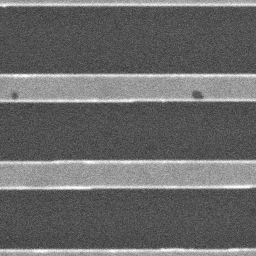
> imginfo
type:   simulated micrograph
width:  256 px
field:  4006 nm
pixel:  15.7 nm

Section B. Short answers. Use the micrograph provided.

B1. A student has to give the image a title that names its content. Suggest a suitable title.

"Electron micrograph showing lines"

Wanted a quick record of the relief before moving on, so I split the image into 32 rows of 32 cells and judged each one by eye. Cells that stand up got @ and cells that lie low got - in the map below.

@@@@@@@@@@@@@@@@@@@@@@@@@@@@@@@@
--------------------------------
--------------------------------
--------------------------------
--------------------------------
--------------------------------
--------------------------------
--------------------------------
--------------------------------
@@@@@@@@@@@@@@@@@@@@@@@@@@@@@@@@
@@@@@@@@@@@@@@@@@@@@@@@@@@@@@@@@
@@@@@@@@@@@@@@@@@@@@@@@@@@@@@@@@
@@@@@@@@@@@@@@@@@@@@@@@@@@@@@@@@
--------------------------------
--------------------------------
--------------------------------
--------------------------------
--------------------------------
--------------------------------
--------------------------------
@@@@@@@@@@@@@@@@@@@@@@@@@@@@@@@@
@@@@@@@@@@@@@@@@@@@@@@@@@@@@@@@@
@@@@@@@@@@@@@@@@@@@@@@@@@@@@@@@@
@@@@@@@@@@@@--------------------
--------------------------------
--------------------------------
--------------------------------
--------------------------------
--------------------------------
--------------------------------
--------------------------------
@@@@@@@@@@@@@@@@@@@@@@@@@@@@@@@@